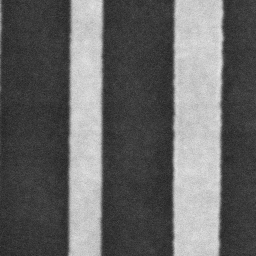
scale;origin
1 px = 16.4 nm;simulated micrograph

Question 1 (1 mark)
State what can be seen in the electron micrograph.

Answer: lines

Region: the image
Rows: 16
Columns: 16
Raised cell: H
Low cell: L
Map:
LLLLHHLLLLLHHHLL
LLLLHHLLLLLHHHLL
LLLLHHLLLLLHHHLL
LLLLHHLLLLLHHHLL
LLLLHHLLLLLHHHLL
LLLLHHLLLLLHHHLL
LLLLHHLLLLLHHHLL
LLLLHHLLLLLHHHLL
LLLLHHLLLLLHHHLL
LLLLHHLLLLLHHHLL
LLLLHHLLLLLHHHLL
LLLLHHLLLLLHHHLL
LLLLHHLLLLLHHHLL
LLLLHHLLLLLHHHLL
LLLLHHLLLLLHHHLL
LLLLHHLLLLLHHHLL